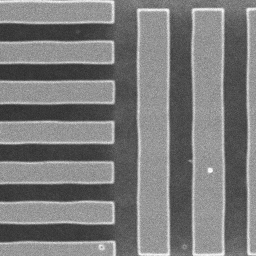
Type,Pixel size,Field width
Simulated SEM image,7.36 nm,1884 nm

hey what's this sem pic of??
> groups of lines, slits or small figures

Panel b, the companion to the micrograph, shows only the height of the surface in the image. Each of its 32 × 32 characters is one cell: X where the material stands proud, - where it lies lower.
XXXXXXXXXXXXXX------------------
XXXXXXXXXXXXXX---XXXX---XXXX---X
XXXXXXXXXXXXXX---XXXX---XXXX---X
-----------------XXXX---XXXX---X
-----------------XXXX---XXXX---X
XXXXXXXXXXXXXX---XXXX---XXXX---X
XXXXXXXXXXXXXX---XXXX---XXXX---X
XXXXXXXXXXXXXX---XXXX---XXXX---X
-----------------XXXX---XXXX---X
-----------------XXXX---XXXX---X
XXXXXXXXXXXXXX---XXXX---XXXX---X
XXXXXXXXXXXXXX---XXXX---XXXX---X
XXXXXXXXXXXXXX---XXXX---XXXX---X
-----------------XXXX---XXXX---X
-----------------XXXX---XXXX---X
XXXXXXXXXXXXXX---XXXX---XXXX---X
XXXXXXXXXXXXXX---XXXX---XXXX---X
XXXXXXXXXXXXXX---XXXX---XXXX---X
-----------------XXXX---XXXX---X
-----------------XXXX---XXXX---X
XXXXXXXXXXXXXX---XXXX---XXXX---X
XXXXXXXXXXXXXX---XXXX---XXXX---X
XXXXXXXXXXXXXX---XXXX---XXXX---X
-----------------XXXX---XXXX---X
-----------------XXXX---XXXX---X
XXXXXXXXXXXXXX---XXXX---XXXX---X
XXXXXXXXXXXXXX---XXXX---XXXX---X
XXXXXXXXXXXXXX---XXXX---XXXX---X
-----------------XXXX---XXXX---X
-----------------XXXX---XXXX---X
XXXXXXXXXXXXXX---XXXX---XXXX---X
XXXXXXXXXXXXXX---XXXX---XXXX---X